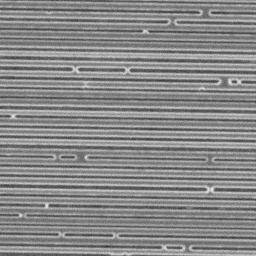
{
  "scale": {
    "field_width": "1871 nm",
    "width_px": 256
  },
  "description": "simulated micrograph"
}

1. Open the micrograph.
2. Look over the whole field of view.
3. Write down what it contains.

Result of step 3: parallel lines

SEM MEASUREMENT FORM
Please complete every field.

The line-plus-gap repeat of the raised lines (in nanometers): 71.7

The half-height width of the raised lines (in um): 0.0466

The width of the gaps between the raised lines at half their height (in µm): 0.0265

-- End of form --